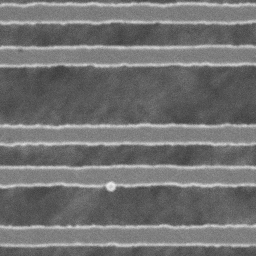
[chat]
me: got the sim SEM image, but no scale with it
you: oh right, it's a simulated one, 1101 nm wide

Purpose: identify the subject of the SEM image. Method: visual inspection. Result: lines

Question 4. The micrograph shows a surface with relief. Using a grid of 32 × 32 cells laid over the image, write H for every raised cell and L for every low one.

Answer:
HHLLHHHHHHHHHLLHHHHLLHHHHHHLHLHH
HHHHHHHHHHHHHHHHHHHHHHHHHHHHHHHH
HHHHHHHHHHHHHHHHHHHHHHHHHHHHHHHH
LLLLLLLLLLLLLLLLLLLLLLLLLLLLLLLL
LLLLLLLLLLLLLLLLLLLLLLLLLLLLLLLL
LLLLLLLLLLLLLLLLLLLLLLLLLLLLLLLL
HHHHHHHHHHHHHHHHHHHHHHHHHHHHHHHH
HHHHHHHHHHHHHHHHHHHHHHHHHHHHHHHH
LLLLLLLLLLLLLLLLLLLLLLLLLLLLLLLL
LLLLLLLLLLLLLLLLLLLLLLLLLLLLLLLL
LLLLLLLLLLLLLLLLLLLLLLLLLLLLLLLL
LLLLLLLLLLLLLLLLLLLLLLLLLLLLLLLL
LLLLLLLLLLLLLLLLLLLLLLLLLLLLLLLL
LLLLLLLLLLLLLLLLLLLLLLLLLLLLLLLL
LLLLLLLLLLLLLLLLLLLLLLLLLLLLLLLL
LLLLLLLLLLLLLLLLLLLLLLLLLLLLLLLL
HHHHHHHHHHHHHHHHHHHHHHHHHHHHHHHH
HHHHHHHHHHHHHHHHHHHHHHHHHHHHHHHH
LLLLLLLLLLLLLLLLLLLLLLLLLLLLLLLL
LLLLLLLLLLLLLLLLLLLLLLLLLLLLLLLL
LLLLLLLLLLLLLLLLLLLLLLLLLLLLLLLL
HHHHHHHHHHHHHHHHHHHHHHHHHHHHHHHH
HHHHHHHHHHHHHHHHHHHHHHHHHHHHHHHH
LLLLLLLLLLLLLHLLLLLLLLLLLLLLLLLL
LLLLLLLLLLLLLLLLLLLLLLLLLLLLLLLL
LLLLLLLLLLLLLLLLLLLLLLLLLLLLLLLL
LLLLLLLLLLLLLLLLLLLLLLLLLLLLLLLL
LLLLLLLLLLLLLLLLLLLLLLLLLLLLLLLL
HHHHHHHHHHHHHHHHHHHHHHHHHHHHHHHH
HHHHHHHHHHHHHHHHHHHHHHHHHHHHHHHH
HHHHHHHHHHHHHHHHHHHHHHHHHHHHHHHH
LLLLLLLLLLLLLLLLLLLLLLLLLLLLLLLL